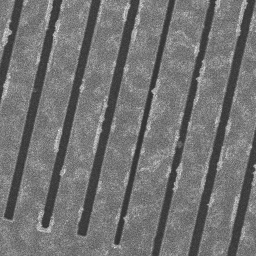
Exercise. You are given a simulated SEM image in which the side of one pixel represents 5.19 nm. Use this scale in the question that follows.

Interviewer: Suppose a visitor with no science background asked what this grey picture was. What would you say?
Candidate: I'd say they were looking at parallel lines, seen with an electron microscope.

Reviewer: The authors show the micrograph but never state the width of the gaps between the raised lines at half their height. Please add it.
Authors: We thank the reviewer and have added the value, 48.7 nanometers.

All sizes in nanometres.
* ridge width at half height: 147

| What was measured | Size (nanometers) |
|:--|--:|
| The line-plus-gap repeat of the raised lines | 196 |